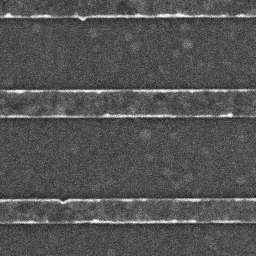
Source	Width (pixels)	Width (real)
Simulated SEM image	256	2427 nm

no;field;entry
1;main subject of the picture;one or a few lines or trenches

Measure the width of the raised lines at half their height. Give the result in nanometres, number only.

244